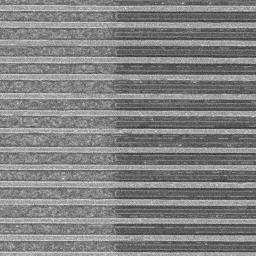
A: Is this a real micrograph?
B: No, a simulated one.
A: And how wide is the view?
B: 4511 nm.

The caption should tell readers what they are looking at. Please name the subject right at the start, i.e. parallel lines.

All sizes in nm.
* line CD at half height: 92.5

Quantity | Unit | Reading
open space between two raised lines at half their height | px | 3.63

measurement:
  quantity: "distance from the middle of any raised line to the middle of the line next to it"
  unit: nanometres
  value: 156